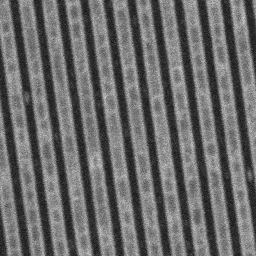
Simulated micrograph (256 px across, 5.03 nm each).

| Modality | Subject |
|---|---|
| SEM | parallel lines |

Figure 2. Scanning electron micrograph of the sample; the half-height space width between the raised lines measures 11.3 px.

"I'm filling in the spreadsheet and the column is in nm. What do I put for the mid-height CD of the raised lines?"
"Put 56.7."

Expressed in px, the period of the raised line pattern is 23.2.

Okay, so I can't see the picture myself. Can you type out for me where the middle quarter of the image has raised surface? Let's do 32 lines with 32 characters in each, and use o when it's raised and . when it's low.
...ooo...ooo...ooo...ooo...oo...
...ooo...ooo...ooo...ooo...oo...
...ooo...ooo...ooo...ooo...oo...
...ooo...ooo...ooo...ooo...ooo..
o...oo...ooo...ooo...ooo...ooo..
o...ooo...oo...ooo...ooo...ooo..
o...ooo...ooo...ooo..ooo...ooo..
o...ooo...ooo...ooo...ooo..ooo..
o...ooo...ooo...ooo...ooo...oo..
o...ooo...ooo...ooo...ooo...oo..
o...ooo...ooo...ooo...ooo...ooo.
oo...oo...ooo...ooo...ooo...ooo.
oo...ooo...oo...ooo...ooo...ooo.
oo...ooo...oo....ooo..ooo...ooo.
oo...ooo...ooo...ooo...oo...ooo.
oo...ooo...ooo...ooo...oo....oo.
oo...ooo...ooo...ooo...ooo...oo.
oo...ooo...ooo...ooo...ooo...ooo
ooo...oo...ooo...ooo...ooo...ooo
ooo...ooo...oo...ooo...ooo...ooo
ooo...ooo...ooo...ooo..ooo...ooo
ooo...ooo...ooo...ooo...oo...ooo
ooo...ooo...ooo...ooo...oo....oo
ooo...ooo...ooo...ooo...ooo...oo
.oo...ooo...ooo...ooo...ooo...oo
.ooo...oo...ooo...ooo...ooo...oo
.oo....ooo...oo...ooo...ooo...oo
.ooo...ooo...ooo...oo...ooo...oo
.ooo...ooo...ooo...ooo...oo...oo
.ooo...ooo...ooo...ooo...ooo...o
.ooo...ooo...ooo...ooo...ooo...o
..oo...ooo...ooo...ooo...ooo...o